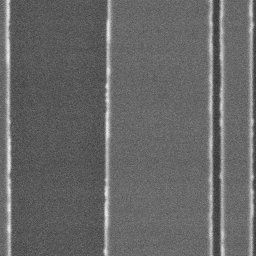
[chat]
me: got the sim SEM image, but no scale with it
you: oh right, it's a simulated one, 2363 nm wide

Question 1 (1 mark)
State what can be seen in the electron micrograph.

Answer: lines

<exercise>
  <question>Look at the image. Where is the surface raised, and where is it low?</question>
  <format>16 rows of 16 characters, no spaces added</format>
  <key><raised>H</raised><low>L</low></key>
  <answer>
HLLLLLLHHHHHHHHH
HLLLLLLHHHHHHHHH
HLLLLLLHHHHHHHHH
HLLLLLLHHHHHHHHH
HLLLLLLHHHHHHHHH
HLLLLLLHHHHHHHHH
HLLLLLLHHHHHHHHH
HLLLLLLHHHHHHHHH
HLLLLLLHHHHHHHHH
HLLLLLLHHHHHHHHH
HLLLLLLHHHHHHHHH
HLLLLLLHHHHHHHHH
HLLLLLLHHHHHHHHH
HLLLLLLHHHHHHHHH
HLLLLLLHHHHHHHHH
HLLLLLLHHHHHHHHH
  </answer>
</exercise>